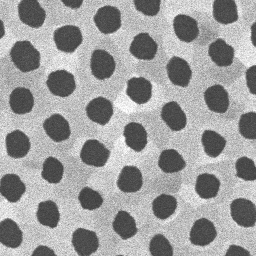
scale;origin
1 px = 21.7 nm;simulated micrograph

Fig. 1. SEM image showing a regular array of holes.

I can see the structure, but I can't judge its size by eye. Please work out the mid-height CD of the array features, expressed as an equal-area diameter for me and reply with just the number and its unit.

0.575 micrometres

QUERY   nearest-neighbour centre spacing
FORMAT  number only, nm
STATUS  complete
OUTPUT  939